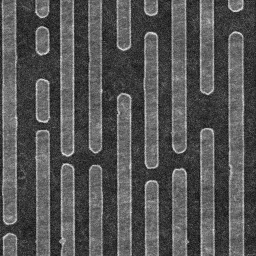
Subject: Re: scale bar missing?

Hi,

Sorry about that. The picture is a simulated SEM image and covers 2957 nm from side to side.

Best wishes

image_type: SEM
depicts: parallel lines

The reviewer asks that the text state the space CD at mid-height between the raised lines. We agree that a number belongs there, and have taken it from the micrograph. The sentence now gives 0.175 µm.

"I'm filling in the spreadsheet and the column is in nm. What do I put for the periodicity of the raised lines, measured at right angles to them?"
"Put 327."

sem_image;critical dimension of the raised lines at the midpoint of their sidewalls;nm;143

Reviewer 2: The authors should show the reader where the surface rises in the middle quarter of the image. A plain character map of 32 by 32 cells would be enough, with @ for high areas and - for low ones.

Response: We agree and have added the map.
@@----@@@-----------@@@----@@@--
@@----@@@-----------@@@----@@@--
@@----@@@-----------@@@----@@@--
@@----@@@-----------@@@----@@@--
@@----@@@-----------@@@----@@@--
@@----@@@-----------@@@----@@@--
@@----@@@@----------@@@----@@@--
@@----@@@-----------@@@----@@@--
@@----@@@-----@@@---@@@----@@@--
@@----@@@-----@@@---@@@----@@@--
@@----@@@-----@@@---@@@----@@@--
@@----@@@-----@@----@@@----@@@--
@@----@@@-----@@----@@@----@@@--
@@-----@@-----@@@---@@@----@@@--
@@-----@@-----@@@---@@@----@@@--
@@-----@@-----@@@---@@@----@@@--
@@-----@@-----@@@---@@@----@@@--
@@-----@@-----@@@---@@@----@@@--
@@-----@@-----@@@---@@@----@@@--
@@-----@@-----@@@---@@@----@@@--
@@-----@@-----@@@---@@@----@@@--
@@-----@@-----@@----@@@-----@@--
@@------------@@----@@@---------
--------------@@----@@@---------
--------------@@@---@@@---------
@@-----@------@@@----@@---------
@@-----@@-----@@@-----------@@--
@@-----@@-----@@@----------@@@--
@@-----@@-----@@@----------@@@--
@@-----@@-----@@@----@@----@@@--
@@-----@@-----@@@---@@@----@@@--
@@-----@@-----@@@---@@@----@@@--